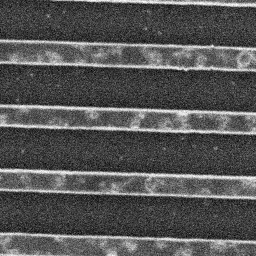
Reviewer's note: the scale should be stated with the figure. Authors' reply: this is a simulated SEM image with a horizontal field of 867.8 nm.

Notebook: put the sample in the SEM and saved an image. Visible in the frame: one or a few lines or trenches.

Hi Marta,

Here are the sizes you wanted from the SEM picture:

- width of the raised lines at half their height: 70.4 nanometres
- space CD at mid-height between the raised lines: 0.144 microns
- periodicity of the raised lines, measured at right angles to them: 218 nm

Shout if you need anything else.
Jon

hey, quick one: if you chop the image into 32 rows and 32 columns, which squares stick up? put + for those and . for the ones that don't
...........................+++++
................................
................................
................................
................................
+++++++++++.++..................
++++++++++++++++++++++++++++++++
++++++++++++++++++++++++++++++++
......................++++++++++
................................
................................
................................
................................
+++++++++.......................
++++++++++++++++++++++++++++++++
++++++++++++++++++++++++++++++++
..........................++++++
................................
................................
................................
................................
+++++++.........................
++++++++++++++++++++++++++++++++
++++++++++++++++++++++++++++++++
.......................+++++++++
................................
................................
................................
................................
+++++++.........................
++++++++++++++++++++++++++++++++
++++++++++++++++++++++++++++++++